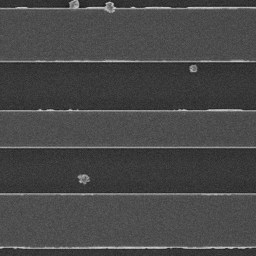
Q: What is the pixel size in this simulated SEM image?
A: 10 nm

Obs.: lines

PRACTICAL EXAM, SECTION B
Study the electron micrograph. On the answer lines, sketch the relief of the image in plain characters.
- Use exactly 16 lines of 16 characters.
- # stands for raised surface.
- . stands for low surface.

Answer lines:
.#..############
################
################
################
................
................
................
################
################
................
................
................
################
################
################
................